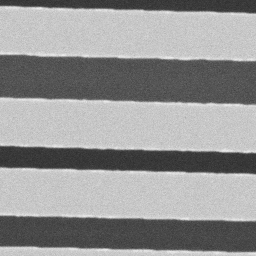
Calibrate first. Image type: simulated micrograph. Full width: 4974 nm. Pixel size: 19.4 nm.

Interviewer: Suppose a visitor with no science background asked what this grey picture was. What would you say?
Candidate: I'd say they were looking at lines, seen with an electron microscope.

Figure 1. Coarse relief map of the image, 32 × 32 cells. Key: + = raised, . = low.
................................
++++++++++++++++++++++..........
++++++++++++++++++++++++++++++++
++++++++++++++++++++++++++++++++
++++++++++++++++++++++++++++++++
++++++++++++++++++++++++++++++++
++++++++++++++++++++++++++++++++
.............................+++
................................
................................
................................
................................
++++++..........................
++++++++++++++++++++++++++++++++
++++++++++++++++++++++++++++++++
++++++++++++++++++++++++++++++++
++++++++++++++++++++++++++++++++
++++++++++++++++++++++++++++++++
............++++++++++++++++++++
................................
................................
+++++++++++++++++++.............
++++++++++++++++++++++++++++++++
++++++++++++++++++++++++++++++++
++++++++++++++++++++++++++++++++
++++++++++++++++++++++++++++++++
++++++++++++++++++++++++++++++++
............................++++
................................
................................
................................
+++++++++++++++++++++++++.......